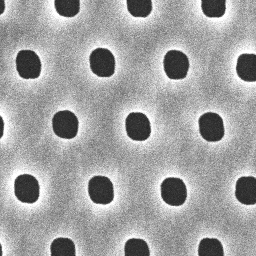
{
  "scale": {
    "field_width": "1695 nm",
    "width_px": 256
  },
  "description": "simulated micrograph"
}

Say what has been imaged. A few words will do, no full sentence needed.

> a regular array of holes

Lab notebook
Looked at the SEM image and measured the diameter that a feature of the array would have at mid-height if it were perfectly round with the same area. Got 188 nanometers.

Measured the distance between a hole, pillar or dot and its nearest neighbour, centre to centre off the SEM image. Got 0.478 µm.